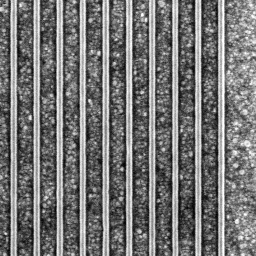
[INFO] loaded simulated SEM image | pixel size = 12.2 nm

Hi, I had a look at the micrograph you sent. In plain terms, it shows parallel lines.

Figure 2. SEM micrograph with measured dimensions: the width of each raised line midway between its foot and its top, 58.1 nanometres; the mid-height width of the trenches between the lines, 0.217 micrometres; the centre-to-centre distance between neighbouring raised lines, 23.1 px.